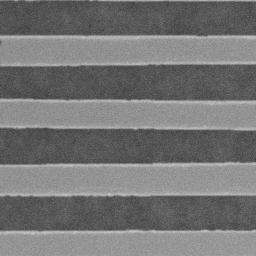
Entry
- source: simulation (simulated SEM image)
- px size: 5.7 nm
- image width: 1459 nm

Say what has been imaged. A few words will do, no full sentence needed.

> lines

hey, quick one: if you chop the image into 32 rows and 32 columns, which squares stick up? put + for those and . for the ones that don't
................................
................................
................................
................................
................................
++++++++++++++++++++++++++++++++
++++++++++++++++++++++++++++++++
++++++++++++++++++++++++++++++++
................................
................................
................................
................................
................................
++++++++++++++++++++++++++++++++
++++++++++++++++++++++++++++++++
++++++++++++++++++++++++++++++++
................................
................................
................................
................................
.......................++.++++++
++++++++++++++++++++++++++++++++
++++++++++++++++++++++++++++++++
++++++++++++++++++++++++++++++++
................................
................................
................................
................................
................................
++++++++++++++++++++++++++++++++
++++++++++++++++++++++++++++++++
++++++++++++++++++++++++++++++++